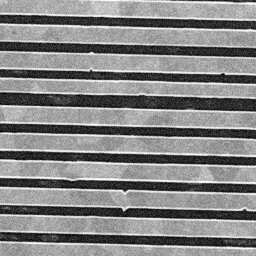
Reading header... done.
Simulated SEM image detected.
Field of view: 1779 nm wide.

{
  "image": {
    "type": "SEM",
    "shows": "parallel lines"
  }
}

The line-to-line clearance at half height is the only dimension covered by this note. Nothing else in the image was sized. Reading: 71.2 nm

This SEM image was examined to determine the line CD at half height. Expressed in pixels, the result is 16.9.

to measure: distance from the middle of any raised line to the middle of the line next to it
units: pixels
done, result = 27.2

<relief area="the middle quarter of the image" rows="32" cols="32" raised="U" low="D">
UUUUUUUUUUUUUUUUUUUUUUUUUUUUUUUU
DDDDDUDUUUUUUUUUUUUUUUUUUUUUUUUU
DDDDDDDDDDDDDDDDDDDDDDDDDDDDDDDD
DDDDDDDDDDDDDDDDDDDDDDDDDDDDDDDD
UUUUUUUUUUUUUUUUUUDUUUUDDDDDDDDD
UUUUUUUUUUUUUUUUUUUUUUUUUUUUUUUU
UUUUUUUUUUUUUUUUUUUUUUUUUUUUUUUU
DDDDDDDDUUUUUUDUUUUUUUUUUUUUUUUU
DDDDDDDDDDDDDDDDDDDDDDDDDDDDDDDD
DDDDDDDDDDDDDDDDDDDDDDDDDDDDDDDD
DDDDDDDDDDDDDDDDDDDDDDDDDDDDDDDD
UUUUUUUUUUUUUUUUUUUUUUUDDDDDDDDD
UUUUUUUUUUUUUUUUUUUUUUUUUUUUUUUU
UUUUUUUUUUUUUUUUUUUUUUUUUUUUUUUU
UUUUUUUUUUUUUUUUUUUUUUUUUUUUUUUU
DDDDDDDDDDDDDDDDDDDDDDDUUUUUUUUU
DDDDDDDDDDDDDDDDDDDDDDDDDDDDDDDD
DDDDDDDDDDDDDDDDDDDDDDDDDDDDDDDD
UUUUUUUUUUUUUUUUUUUUUUUUUDUUUUUU
UUUUUUUUUUUUUUUUUUUUUUUUUUUUUUUU
UUUUUUUUUUUUUUUUUUUUUUUUUUUUUUUU
UUUUUUUUUUUUUUUUUUUUUUUUUUUUUUUU
DDDDDDDDDDDDDDDDDDDDDDDDDDDDDDDU
DDDDDDDDDDDDDDDDDDDDDDDDDDDDDDDD
DDDDDDDDDDDDDDDDDDDDDDDDDDDDDDDD
UUUUUUUUUUUUUUUUUUUUUUUUUUUUUUUU
UUUUUUUUUUUUUUUUUUUUUUUUUUUUUUUU
UUUUUUUUUUUUUUUUUUUUUUUUUUUUUUUU
UUUUUUUUUUUUUUUUUUUUUUUUUUUUUUUU
DDDDDDDDDDDDDDDDDDDDDDDDDDDDDDDD
DDDDDDDDDDDDDDDDDDDDDDDDDDDDDDDD
UDDDDDDDDDDDDDDDDDDDDDDDDDDDDDDD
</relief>